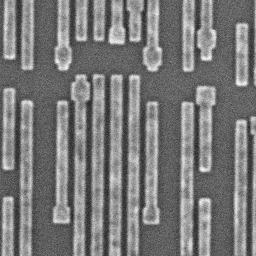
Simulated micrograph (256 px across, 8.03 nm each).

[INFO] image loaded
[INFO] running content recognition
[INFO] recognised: wiring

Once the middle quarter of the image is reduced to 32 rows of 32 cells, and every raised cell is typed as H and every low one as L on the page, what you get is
HLLLLLLLLLLLLLLLLLLLLHHLLLLLLLHH
LLLLLLLLLLLLLLLLLLLLLHHLLLLLLLHH
LLLLLLLLLLLLLLLLLLLLLLLLLLLLLLLL
LLLHHLLHHHLLHHLLLHHLLLLLLLLLLLLL
LLLHHHLHHHLLHHLLLHHLLLLLLLLLLLLL
LLHHHHLHHHLLHHLLLHHLLLLLLLLLLLLL
LLHHHHLHHHLLHHLLLHLLLLLLLLLLLLLL
LLHHHHLHHHLLHHLLLHLLLLLLLLLLLLLL
LLHHHHLHHHLLHHLLLHLLLLLLLLLLLLLL
LLLHHLLHHHLLHHLLLHLLLLLLLLLLLLLL
HLLHHLLHHHLLHHLLLHLLLHHLLLLLLLHH
HLLHHLLHHHLLHHLLHHLLLHHLLLLLLLHH
HLLHHLLHHHLLHHLLHHLLLHHLLLLLLLHH
HLLHHLLHHHLLHHLLHHLLLHHLLLLLLLHH
HLLHHLLHHHLLHHLLHHLLLHHLLLLLLLHH
HLLHHLLHHHLLHHLLHHLLLHHLLLLLLLHH
HLLHHLLHHHLLHHLLHHLLLHHLLLLLLLHH
HLLHHLLHHHLLHHLLHHLLLHHLLLLLLLHH
HLLHHLLHHHLLHHLLHHLLLHHLLLLLLLHH
HLLHHLLHHHLLHHLLHHLLLHHLLLLLLLHH
HLLHHLLHHHLLHHLLHHLLLHHLLLLLLLHH
HLLHHLLHHHLLHHLLHHLLLHHLLLLLLLHH
HLLHHLLHHHLLHHLLHHLLLHHLLLLLLLHH
HLLHHLLHHHLLHHLLHHLLLHHLLLLLLLHH
HLLHHLLHHHLLHHLLHHLLLHHLLLLLLLHH
HLLHHLLHHHLLHHLLHHLLLHHLLLLLLLHH
HLLHHLLHHHLLHHLLHHLLLHHLLLLLLLHH
HLLHHLLHHHLLHHLLHHLLLHHLLLLLLLHH
HLLHHLLHHHLLHHLLHHLLLHHLLLLLLLHH
HLLHHLLHHHLLHHLLHHLLLHHLLLLLLLHH
LLLHHLLHHHLLHHLLHHLLLHHLLLLLLLHH
LLLHHLLHHHLLHHLLHHLLLHHLLLLLLLHH